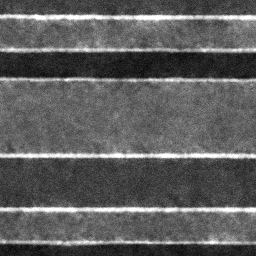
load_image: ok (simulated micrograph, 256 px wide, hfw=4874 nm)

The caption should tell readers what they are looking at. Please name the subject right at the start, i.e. lines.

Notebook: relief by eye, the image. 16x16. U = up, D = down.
DDDDDDDDDDDDDDDD
UUUUUUUUUUUUUUUU
UUUUUUUUUUUUUUUU
DDDDDDDDDDDDDDDD
DDDDDDDDDDDDDDDD
UUUUUUUUUUUUUUUU
UUUUUUUUUUUUUUUU
UUUUUUUUUUUUUUUU
UUUUUUUUUUUUUUUU
UUUUUUUUUUUUUUUU
DDDDDDDDDDDDDDDD
DDDDDDDDDDDDDDDD
DDDDDDDDDDDDDDDD
UUUUUUUUUUUUUUUU
UUUUUUUUUUUUUUUU
DDDDDDDDDDDDDDDD